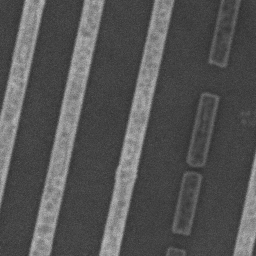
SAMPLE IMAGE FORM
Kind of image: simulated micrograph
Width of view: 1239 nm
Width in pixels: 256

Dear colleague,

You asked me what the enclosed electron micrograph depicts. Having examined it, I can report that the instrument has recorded one or a few lines or trenches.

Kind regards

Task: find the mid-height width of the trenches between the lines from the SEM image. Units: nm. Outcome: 235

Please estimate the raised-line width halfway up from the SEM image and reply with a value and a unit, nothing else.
81 nm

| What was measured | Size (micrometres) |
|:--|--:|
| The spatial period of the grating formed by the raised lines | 0.314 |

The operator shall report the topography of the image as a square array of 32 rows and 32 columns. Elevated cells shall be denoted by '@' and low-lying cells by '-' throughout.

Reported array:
---@@------@@------@@-------@@--
---@@-----@@@------@@-------@@--
---@@-----@@-------@@------@@---
---@@-----@@-------@@------@@---
--@@------@@-------@@------@@---
--@@------@@------@@-------@@---
--@@-----@@-------@@------@@@---
--@@-----@@-------@@------@@----
--@@-----@@-------@@------------
-@@------@@------@@@------------
-@@-----@@@------@@-------------
-@@-----@@-------@@-------------
-@@-----@@-------@@------@@-----
@@@-----@@-------@@------@@-----
@@------@@------@@-------@@-----
@@-----@@@------@@-------@@-----
@@-----@@-------@@------@@------
@@-----@@-------@@------@@------
@------@@-------@@------@@------
@------@@------@@-------@@------
@-----@@-------@@-------@-------
@-----@@-------@@---------------
@-----@@-------@@------@@------@
------@@------@@-------@@------@
-----@@@------@@-------@@------@
-----@@-------@@------@@-------@
-----@@-------@@------@@-------@
-----@@-------@@------@@------@@
-----@@------@@-------@@------@@
----@@@------@@---------------@@
----@@-------@@---------------@@
----@@-------@@------@@------@@-